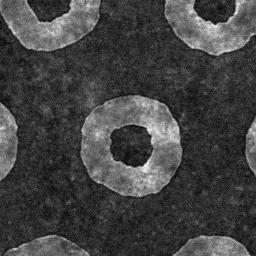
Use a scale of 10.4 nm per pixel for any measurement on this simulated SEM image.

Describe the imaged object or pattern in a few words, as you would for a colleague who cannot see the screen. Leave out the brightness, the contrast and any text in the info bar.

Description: ring-shaped raised bodies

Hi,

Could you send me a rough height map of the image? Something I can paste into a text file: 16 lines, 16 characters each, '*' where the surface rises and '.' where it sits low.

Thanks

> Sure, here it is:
**..**....**...*
******.....*****
.****......*****
................
................
................
......****......
*....******.....
*....**..**....*
*....**...*....*
*....******.....
......****......
................
................
................
.****......****.